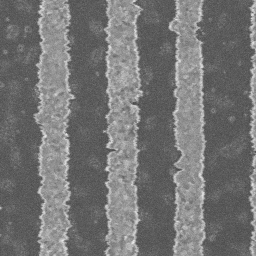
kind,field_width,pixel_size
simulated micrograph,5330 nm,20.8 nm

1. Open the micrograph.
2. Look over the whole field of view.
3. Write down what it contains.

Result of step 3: one or a few lines or trenches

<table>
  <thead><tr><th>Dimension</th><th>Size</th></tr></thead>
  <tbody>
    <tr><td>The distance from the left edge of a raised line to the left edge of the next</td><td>1400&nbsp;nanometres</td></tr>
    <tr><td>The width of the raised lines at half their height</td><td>0.548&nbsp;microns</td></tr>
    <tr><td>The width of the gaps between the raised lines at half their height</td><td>888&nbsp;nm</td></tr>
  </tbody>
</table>